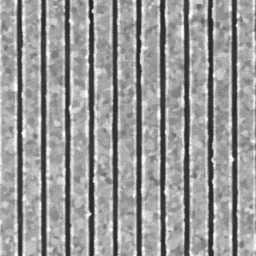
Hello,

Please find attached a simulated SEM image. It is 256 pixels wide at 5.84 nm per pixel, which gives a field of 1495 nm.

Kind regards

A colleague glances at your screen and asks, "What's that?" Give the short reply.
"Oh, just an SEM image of parallel lines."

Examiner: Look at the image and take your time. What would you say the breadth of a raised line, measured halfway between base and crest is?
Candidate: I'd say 103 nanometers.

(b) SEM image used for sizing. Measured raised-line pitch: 139 nanometers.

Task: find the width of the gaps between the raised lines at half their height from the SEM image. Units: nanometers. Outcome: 37.2